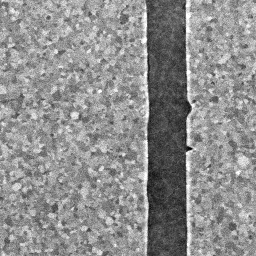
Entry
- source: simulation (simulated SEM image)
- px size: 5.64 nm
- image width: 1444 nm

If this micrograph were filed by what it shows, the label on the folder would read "one or a few lines or trenches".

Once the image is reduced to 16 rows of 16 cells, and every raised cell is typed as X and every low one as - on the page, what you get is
XXXXXXXXX---XXXX
XXXXXXXXX---XXXX
XXXXXXXXX---XXXX
XXXXXXXXX---XXXX
XXXXXXXXX---XXXX
XXXXXXXXX---XXXX
XXXXXXXXX---XXXX
XXXXXXXXX---XXXX
XXXXXXXXX---XXXX
XXXXXXXXX---XXXX
XXXXXXXXX---XXXX
XXXXXXXXX---XXXX
XXXXXXXXX---XXXX
XXXXXXXXX---XXXX
XXXXXXXXX---XXXX
XXXXXXXXX---XXXX